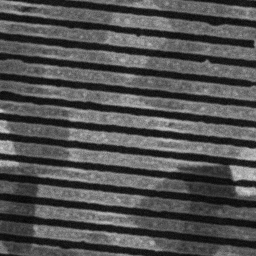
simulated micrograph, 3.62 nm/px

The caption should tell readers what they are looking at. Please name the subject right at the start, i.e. parallel lines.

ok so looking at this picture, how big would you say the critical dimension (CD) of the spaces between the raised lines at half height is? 0.0265 µm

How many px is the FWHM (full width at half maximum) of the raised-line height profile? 11.9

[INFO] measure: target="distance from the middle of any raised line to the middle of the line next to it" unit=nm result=72.2